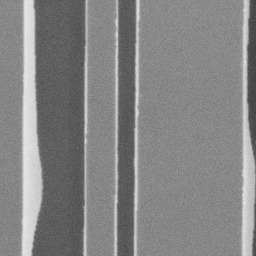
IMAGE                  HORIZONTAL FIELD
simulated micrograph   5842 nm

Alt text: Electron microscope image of lines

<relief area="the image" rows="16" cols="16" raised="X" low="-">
XX---XXXXXXXXXX-
XX---XXXXXXXXXX-
XX---XXXXXXXXXX-
XX---XXXXXXXXXX-
XX---XXXXXXXXXX-
XX---XXXXXXXXXX-
XX---XXXXXXXXXX-
XX---XXXXXXXXXX-
XX---XXXXXXXXXX-
XX---XXXXXXXXXX-
XX---XXXXXXXXXXX
XX---XXXXXXXXXXX
XX---XXXXXXXXXXX
XX---XXXXXXXXXX-
XX---XXXXXXXXXX-
XX---XXXXXXXXXX-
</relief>